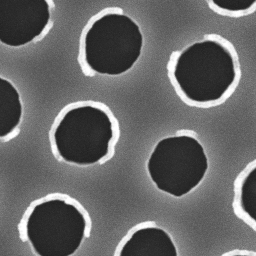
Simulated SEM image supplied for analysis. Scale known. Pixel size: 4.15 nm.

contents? holes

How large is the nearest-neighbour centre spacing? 397 nanometres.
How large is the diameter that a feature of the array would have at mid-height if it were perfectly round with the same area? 0.245 micrometres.